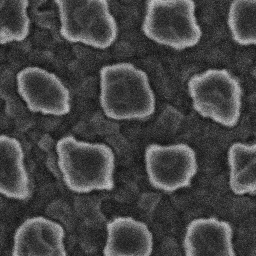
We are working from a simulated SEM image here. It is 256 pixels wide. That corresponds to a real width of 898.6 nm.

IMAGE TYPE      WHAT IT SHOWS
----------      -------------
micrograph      raised bodies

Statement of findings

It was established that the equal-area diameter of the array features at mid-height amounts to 176 nm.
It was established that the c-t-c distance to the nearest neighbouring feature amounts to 292 nanometres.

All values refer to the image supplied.